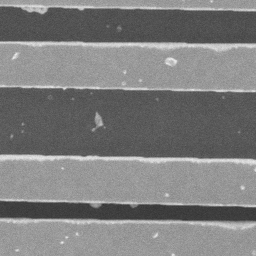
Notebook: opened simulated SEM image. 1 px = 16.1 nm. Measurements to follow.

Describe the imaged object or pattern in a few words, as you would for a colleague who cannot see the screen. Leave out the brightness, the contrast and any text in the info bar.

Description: lines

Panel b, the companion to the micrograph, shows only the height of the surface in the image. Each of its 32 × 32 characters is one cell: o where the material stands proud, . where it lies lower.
oooooooooooooooooooooooooooooooo
................................
................................
................................
................................
ooooooooooooooooooo.............
oooooooooooooooooooooooooooooooo
oooooooooooooooooooooooooooooooo
oooooooooooooooooooooooooooooooo
oooooooooooooooooooooooooooooooo
oooooooooooooooooooooooooooooooo
................................
................................
................................
................................
................................
................................
................................
................................
ooo.............................
oooooooooooooooooooooooooooooooo
oooooooooooooooooooooooooooooooo
oooooooooooooooooooooooooooooooo
oooooooooooooooooooooooooooooooo
oooooooooooooooooooooooooooooooo
....................oooooooooooo
................................
oooooooooo......................
oooooooooooooooooooooooooooooooo
oooooooooooooooooooooooooooooooo
oooooooooooooooooooooooooooooooo
oooooooooooooooooooooooooooooooo